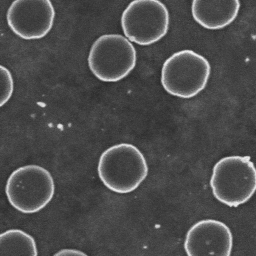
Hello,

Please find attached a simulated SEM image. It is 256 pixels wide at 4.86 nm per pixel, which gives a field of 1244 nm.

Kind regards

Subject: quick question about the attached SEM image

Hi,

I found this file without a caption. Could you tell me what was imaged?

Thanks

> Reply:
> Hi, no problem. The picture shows raised bodies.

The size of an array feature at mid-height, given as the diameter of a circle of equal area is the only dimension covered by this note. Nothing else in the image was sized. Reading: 0.223 micrometres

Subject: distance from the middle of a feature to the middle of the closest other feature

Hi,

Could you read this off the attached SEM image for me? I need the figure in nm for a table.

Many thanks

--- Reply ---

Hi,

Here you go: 412